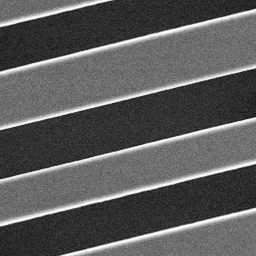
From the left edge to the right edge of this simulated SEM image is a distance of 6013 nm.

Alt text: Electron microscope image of lines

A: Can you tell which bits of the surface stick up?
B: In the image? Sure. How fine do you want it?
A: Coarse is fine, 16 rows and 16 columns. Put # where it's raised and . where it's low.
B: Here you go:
#####...........
............####
........########
....############
###############.
###########.....
######..........
##.............#
...........#####
.......#########
...############.
###########.....
######..........
##............##
..........######
......##########